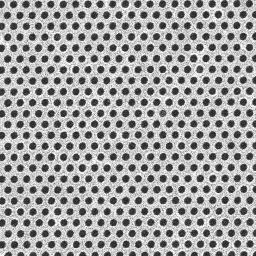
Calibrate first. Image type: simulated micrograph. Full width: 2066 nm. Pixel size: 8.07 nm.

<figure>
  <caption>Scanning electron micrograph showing a regular array of holes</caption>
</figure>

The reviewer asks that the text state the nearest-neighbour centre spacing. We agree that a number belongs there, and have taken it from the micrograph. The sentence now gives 97.9 nm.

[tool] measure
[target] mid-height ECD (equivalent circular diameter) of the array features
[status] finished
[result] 7.31 px